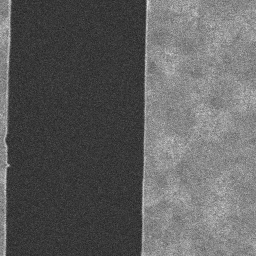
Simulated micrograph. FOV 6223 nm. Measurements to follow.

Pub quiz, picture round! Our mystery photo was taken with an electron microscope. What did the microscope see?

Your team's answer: one or a few lines or trenches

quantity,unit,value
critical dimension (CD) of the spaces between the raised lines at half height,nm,3330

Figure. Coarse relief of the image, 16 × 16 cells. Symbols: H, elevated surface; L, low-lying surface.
HLLLLLLLLHHHHHHH
LLLLLLLLLHHHHHHH
LLLLLLLLLHHHHHHH
HLLLLLLLLHHHHHHH
LLLLLLLLLHHHHHHH
LLLLLLLLLHHHHHHH
LLLLLLLLLHHHHHHH
LLLLLLLLLHHHHHHH
LLLLLLLLLHHHHHHH
LLLLLLLLLHHHHHHH
LLLLLLLLLHHHHHHH
LLLLLLLLLHHHHHHH
LLLLLLLLLHHHHHHH
LLLLLLLLLHHHHHHH
LLLLLLLLLHHHHHHH
LLLLLLLLLHHHHHHH